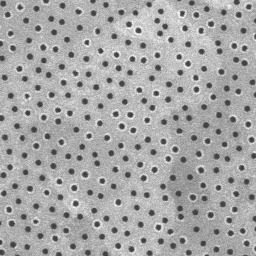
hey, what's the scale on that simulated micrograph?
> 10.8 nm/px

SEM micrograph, a regular array of holes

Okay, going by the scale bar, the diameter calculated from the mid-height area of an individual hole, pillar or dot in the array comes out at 67.9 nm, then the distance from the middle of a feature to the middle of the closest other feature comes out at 144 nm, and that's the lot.